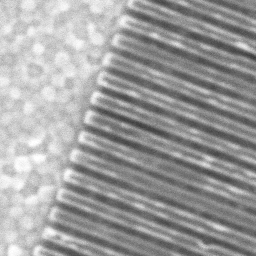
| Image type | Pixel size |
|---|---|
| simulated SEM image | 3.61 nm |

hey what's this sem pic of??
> parallel lines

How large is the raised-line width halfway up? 43.1 nanometers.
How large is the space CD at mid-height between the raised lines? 32.5 nanometres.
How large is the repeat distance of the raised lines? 74 nm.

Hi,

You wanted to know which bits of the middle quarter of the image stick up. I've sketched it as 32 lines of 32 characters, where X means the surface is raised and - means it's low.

------------XXXXXXX-------XXXXXX
---------------XXXXXXX-------XXX
---------XX-------XXXXXXX-------
---------XXXXX------XXXXXXX-----
---------XXXXXXX-------XXXXXXXX-
----------XXXXXXXX--------XXXXXX
-------------XXXXXXXX-------XXXX
--------X------XXXXXXXXX------XX
-------XXXXX-------XXXXXXX------
-------XXXXXXXX------XXXXXXXX---
---------XXXXXXXX-------XXXXXXXX
------------XXXXXXXX-------XXXXX
------XXX-----XXXXXXXXX------XXX
-----XXXXXX------XXXXXXXX-------
-----XXXXXXXXX------XXXXXXXX----
-------XXXXXXXXXX-----XXXXXXXX--
----------XXXXXXXXX------XXXXXXX
----XX-------XXXXXXXXX------XXXX
----XXXXX------XXXXXXXXX------XX
-----XXXXXXX-------XXXXXXXX-----
-------XXXXXXXX------XXXXXXXX---
----------XXXXXXXX------XXXXXXXX
--XXX--------XXXXXXX-------XXXXX
--XXXXXX-------XXXXXXXX------XXX
---XXXXXXXX-------XXXXXXXX------
------XXXXXXX-------XXXXXXXX----
--------XXXXXXXXX-----XXXXXXXXX-
XXXX-------XXXXXXXX------XXXXXXX
XXXXXX--------XXXXXXXX------XXXX
--XXXXXXX-------XXXXXXXX------XX
-----XXXXXXX-------XXXXXXXX-----
-------XXXXXXX-------XXXXXXXX---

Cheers